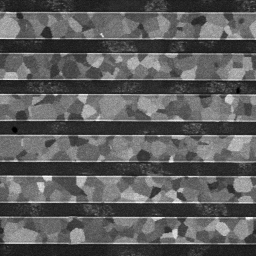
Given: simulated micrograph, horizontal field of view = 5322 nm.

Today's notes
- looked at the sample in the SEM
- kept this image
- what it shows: parallel lines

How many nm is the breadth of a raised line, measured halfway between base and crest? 543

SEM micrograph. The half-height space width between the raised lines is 309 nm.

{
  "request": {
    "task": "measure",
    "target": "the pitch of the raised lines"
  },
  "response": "851 nanometres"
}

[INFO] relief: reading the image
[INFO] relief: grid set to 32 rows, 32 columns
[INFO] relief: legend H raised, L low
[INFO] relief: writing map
LLLLLLLLLLLLLLLLLLLLLLLLLLLLLLLL
LLLLLLLLLLLLLLLLLLLLLLLLLLLLLLLL
HHHHHHHHHHHHHHHHHHHHHHHHHHHHHHHH
HHHHHHHHHHHHHHHHHHHHHHHHHHHHHHHH
HHHHHHHHHHHHHHHHHHHHHHHHHHHHHHHH
LLLLLLLLLLLLLLLLLLLLLLLLLLLLLLLL
LLLLLLLLLLLLLLLLLLLLLLLLLLLLLLLL
HHHHHHHHHHHHHHHHHHHHHHHHHHHHHHHH
HHHHHHHHHHHHHHHHHHHHHHHHHHHHHHHH
HHHHHHHHHHHHHHHHHHHHHHHHHHHHHHHH
LLLLLLLLLLLLLLLLLLLLLLLLLLLLLLLL
LLLLLLLLLLLLLLLLLLLLLLLLLLLLLLLL
HHHHHHHHHHHHHHHHHHHHHHHHHHHHHHHH
HHHHHHHHHHHHHHHHHHHHHHHHHHHHHHHH
HHHHHHHHHHHHHHHHHHHHHHHHHHHHHHHH
LLLLLLLLLLLLLLLLLLLLLLLLLLLLLLLL
LLLLLLLLLLLLLLLLLLLLLLLLLLLLLLLL
HHHHHHHHHHHHHHHHHHHHHHHHHHHHHHHH
HHHHHHHHHHHHHHHHHHHHHHHHHHHHHHHH
HHHHHHHHHHHHHHHHHHHHHHHHHHHHHHHH
LLLLLLLLLLLLLLLLLLLLLLLLLLLLLLLL
LLLLLLLLLLLLLLLLLLLLLLLLLLLLLLLL
HHHHHHHHHHHHHHHHHHHHHHHHHHHHHHHH
HHHHHHHHHHHHHHHHHHHHHHHHHHHHHHHH
HHHHHHHHHHHHHHHHHHHHHHHHHHHHHHHH
LLLLLLLLLLLLLLLLLLLLLLLLLLLLLLLL
LLLLLLLLLLLLLLLLLLLLLLLLLLLLLLLL
HHHHHHHHHHHHHHHHHHHHHHHHHHHHHHHH
HHHHHHHHHHHHHHHHHHHHHHHHHHHHHHHH
HHHHHHHHHHHHHHHHHHHHHHHHHHHHHHHH
LLLLLLLLLLLLLLLLLLLLLLLLLLLLLLLL
LLLLLLLLLLLLLLLLLLLLLLLLLLLLLLLL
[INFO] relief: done